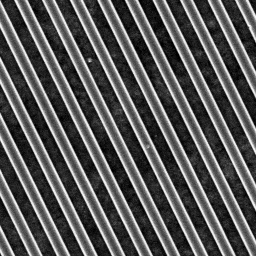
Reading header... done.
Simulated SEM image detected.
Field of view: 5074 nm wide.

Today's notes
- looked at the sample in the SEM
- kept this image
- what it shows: parallel lines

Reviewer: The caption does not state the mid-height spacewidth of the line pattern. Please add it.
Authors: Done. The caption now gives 13.9 px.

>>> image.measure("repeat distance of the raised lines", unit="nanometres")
491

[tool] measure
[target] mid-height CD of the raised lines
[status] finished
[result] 207 nm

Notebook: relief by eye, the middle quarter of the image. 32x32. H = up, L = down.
LLLHHLLLLLHHLLLLLHHLLLLHHHLLLLHH
LLLHHHLLLLHHHLLLLHHHLLLLHHHLLLLH
LLLLHHLLLLLHHLLLLLHHLLLLHHHLLLLH
LLLLHHHLLLLHHHLLLLHHHLLLLHHHLLLL
HLLLLHHLLLLLHHLLLLLHHLLLLHHHLLLL
HLLLLHHHLLLLHHHLLLLHHHLLLLHHHLLL
HHLLLLHHLLLLLHHLLLLLHHLLLLHHHLLL
HHLLLLHHHLLLLHHHLLLLHHHLLLLHHHLL
HHHLLLLHHLLLLLHHLLLLLHHLLLLHHHLL
HHHLLLLHHHLLLLHHHLLLLHHHLLLLHHHL
LHHHLLLLHHLLLLLHHLLLLLHHLLLLHHHL
LHHHLLLLHHHLLLLHHHLLLLHHHLLLLHHH
LLHHHLLLLHHLLLLLHHLLLLLHHLLLLHHH
LLHHHLLLLHHHLLLLHHHLLLLHHHLLLLHH
LLLHHHLLLLHHLLLLLHHLLLLLHHLLLLHH
LLLHHHLLLLHHHLLLLHHHLLLLHHHLLLLH
LLLLHHHLLLLHHLLLLLHHLLLLLHHLLLLH
LLLLHHHLLLLHHHLLLLHHHLLLLHHHLLLL
HLLLLHHHLLLLHHLLLLLHHLLLLHHHLLLL
HLLLLHHHLLLLHHHLLLLHHHLLLLHHHLLL
HHLLLLHHHLLLLHHLLLLHHHLLLLHHHLLL
HHLLLLHHHLLLLHHHLLLLHHHLLLLHHHLL
HHHLLLLHHHLLLLHHLLLLHHHLLLLHHHLL
HHHLLLLHHHLLLLHHHLLLLHHHLLLLHHHL
LHHHLLLLHHLLLLLHHLLLLHHHLLLLHHHL
LHHHLLLLHHHLLLLHHHLLLLHHHLLLLHHH
LLHHLLLLLHHLLLLHHHLLLLHHHLLLLHHH
LLHHHLLLLHHHLLLLHHHLLLLHHHLLLLHH
LLLHHLLLLLHHLLLLHHHLLLLHHHLLLLHH
LLLHHHLLLLHHHLLLLHHHLLLLHHHLLLLH
LLLLHHHLLLLHHLLLLHHHLLLLHHHLLLLH
LLLLHHHLLLLHHHLLLLHHHLLLLHHHLLLL